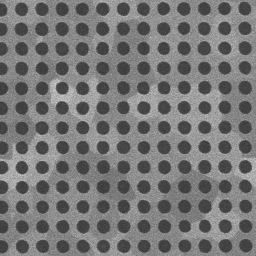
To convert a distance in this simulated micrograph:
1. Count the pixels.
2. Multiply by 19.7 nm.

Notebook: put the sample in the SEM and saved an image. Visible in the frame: a regular array of holes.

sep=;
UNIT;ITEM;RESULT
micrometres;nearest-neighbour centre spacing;0.385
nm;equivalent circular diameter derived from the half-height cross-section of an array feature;269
